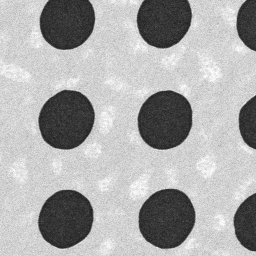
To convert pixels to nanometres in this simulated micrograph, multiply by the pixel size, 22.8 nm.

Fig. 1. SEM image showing holes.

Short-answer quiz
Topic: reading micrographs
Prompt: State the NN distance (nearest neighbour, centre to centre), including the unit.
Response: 2250 nm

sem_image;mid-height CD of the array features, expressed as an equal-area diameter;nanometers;1320